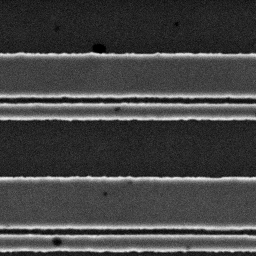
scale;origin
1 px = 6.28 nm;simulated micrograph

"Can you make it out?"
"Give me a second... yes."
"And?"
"lines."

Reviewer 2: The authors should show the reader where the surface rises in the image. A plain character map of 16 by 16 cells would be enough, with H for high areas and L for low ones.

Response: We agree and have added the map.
LLLLLLLLLLLLLLLL
LLLLLLLLLLLLLLLL
LLLLLLLLLLLLLLLL
HHHHHHHHHHHHHHHH
HHHHHHHHHHHHHHHH
HHHHHHHHHHHHHHHH
HHHHHHHHHHHHHHHH
LLLLLLLLLLLLLLLL
LLLLLLLLLLLLLLLL
LLLLLLLLLLLLLLLL
LLLLLLLLLLLLLLLL
HHHHHHHHHHHHHHHH
HHHHHHHHHHHHHHHH
HHHHHHHHHHHHHHHH
HHHHHHHHHHHHHHHH
HHHHHHHHHHHHHHHH